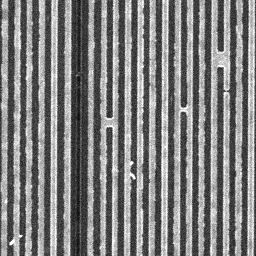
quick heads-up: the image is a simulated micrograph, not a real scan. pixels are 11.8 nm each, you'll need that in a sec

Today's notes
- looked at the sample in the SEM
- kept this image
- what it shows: parallel lines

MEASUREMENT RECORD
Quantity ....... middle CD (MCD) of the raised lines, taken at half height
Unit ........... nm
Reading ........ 57.5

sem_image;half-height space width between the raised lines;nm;91.4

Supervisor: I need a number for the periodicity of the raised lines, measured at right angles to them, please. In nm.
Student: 146